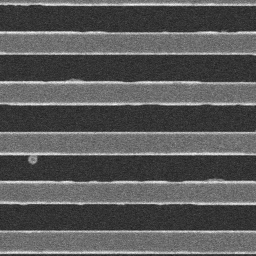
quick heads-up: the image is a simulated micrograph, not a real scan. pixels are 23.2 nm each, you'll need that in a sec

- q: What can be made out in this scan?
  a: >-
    lines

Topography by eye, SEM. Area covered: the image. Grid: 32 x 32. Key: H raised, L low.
HHHHHHHHHHHHHHHHHHHHHHHHHHHHHHHH
LLLLLLLLLLLLLLLLLLLLLLLLLLLLLLLL
LLLLLLLLLLLLLLLLLLLLLLLLLLLLLLLL
LLLLLLLLLLLLLLLLLLLLLLLLLLLLLLLL
HHHHHHHHHHHHHHHHHHHHHHHHHHHHHHHH
HHHHHHHHHHHHHHHHHHHHHHHHHHHHHHHH
HHHHHHHHHHHHHHHHHHHHHHHHHHHHHHHH
LLLLLLLLLLLLLLLLLLLLLLLLLLLLLLLL
LLLLLLLLLLLLLLLLLLLLLLLLLLLLLLLL
LLLLLLLLLLLLLLLLLLLLLLLLLLLLLLLL
HHHHHHHHHHHHHHHHHHHHHHHHHHHHHHHH
HHHHHHHHHHHHHHHHHHHHHHHHHHHHHHHH
HHHHHHHHHHHHHHHHHHHHHHHHHHHHHHHH
LLLLLLLLLLLLLLLLLLLLLLLLLLLLLLLL
LLLLLLLLLLLLLLLLLLLLLLLLLLLLLLLL
LLLLLLLLLLLLLLLLLLLLLLLLLLLLLLLL
LLLLLLLLLLLLLLLLLLLLLLLLLLLLLLLL
HHHHHHHHHHHHHHHHHHHHHHHHHHHHHHHH
HHHHHHHHHHHHHHHHHHHHHHHHHHHHHHHH
LLLLLLLLLLLLLLLLLLLLLLLLLLLLLLLL
LLLLLLLLLLLLLLLLLLLLLLLLLLLLLLLL
LLLLLLLLLLLLLLLLLLLLLLLLLLLLLLLL
LLLLLLLLLLLLLLLLLLLLLLLLLLLLLLLL
HHHHHHHHHHHHHHHHHHHHHHHHHHHHHHHH
HHHHHHHHHHHHHHHHHHHHHHHHHHHHHHHH
LLLLLLLLLHHLLLLLLLLHHLLLHHHHHHHH
LLLLLLLLLLLLLLLLLLLLLLLLLLLLLLLL
LLLLLLLLLLLLLLLLLLLLLLLLLLLLLLLL
LLLLLLLLLLLLLLLLLLLLLLLLLLLLLLLL
HHHHHHHHHHHHHHHHHHHHHHHHHHHHHHHH
HHHHHHHHHHHHHHHHHHHHHHHHHHHHHHHH
HHHHHHHHHHHHHHHHHHHHHHHHHHHHHHHH